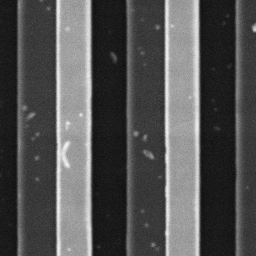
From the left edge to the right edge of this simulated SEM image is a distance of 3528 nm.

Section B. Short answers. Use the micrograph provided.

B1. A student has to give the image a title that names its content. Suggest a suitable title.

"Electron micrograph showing lines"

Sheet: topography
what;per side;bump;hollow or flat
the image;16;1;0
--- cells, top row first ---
0111110011110001
0111110011110001
0111110011110001
0111110011110001
0111110011110001
0111110011110001
0111110011110001
0111110011110001
0111110011110001
0111110011110001
0111110011110001
0111110011110001
0111110011110001
0111110011110001
0111110011110001
0111110011110001